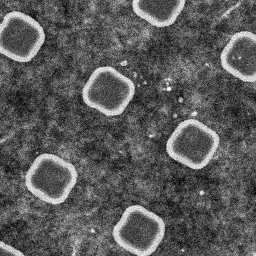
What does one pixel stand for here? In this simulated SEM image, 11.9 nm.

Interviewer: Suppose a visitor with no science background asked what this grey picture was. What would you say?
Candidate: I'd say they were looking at raised bodies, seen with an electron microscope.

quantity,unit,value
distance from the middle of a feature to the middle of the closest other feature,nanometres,1200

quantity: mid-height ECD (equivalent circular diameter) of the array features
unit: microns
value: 0.529